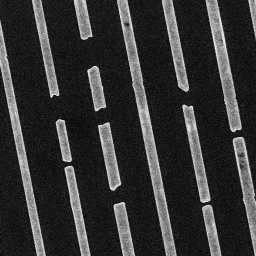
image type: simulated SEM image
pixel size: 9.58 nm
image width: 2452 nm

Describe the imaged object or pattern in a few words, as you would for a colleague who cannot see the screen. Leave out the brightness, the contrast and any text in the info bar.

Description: parallel lines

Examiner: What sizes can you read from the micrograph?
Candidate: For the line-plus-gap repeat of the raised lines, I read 412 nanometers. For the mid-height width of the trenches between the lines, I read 0.315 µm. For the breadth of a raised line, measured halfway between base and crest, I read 96.4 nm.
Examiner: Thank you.